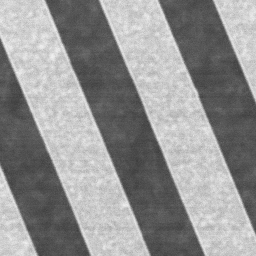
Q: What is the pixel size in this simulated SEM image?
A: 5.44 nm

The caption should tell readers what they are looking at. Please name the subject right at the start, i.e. one or a few lines or trenches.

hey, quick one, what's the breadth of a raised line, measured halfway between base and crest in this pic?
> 285 nanometers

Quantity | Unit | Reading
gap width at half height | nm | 285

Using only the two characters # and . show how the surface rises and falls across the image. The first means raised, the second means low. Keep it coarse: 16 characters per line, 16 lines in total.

###...####....##
###....###....##
####...####...##
.###....###....#
.####...####...#
.####....###....
..###....####...
..####...####...
...###....###...
...####...####..
....###....###..
....###....####.
#...####...####.
#....###....###.
##...####...####
##....###....###